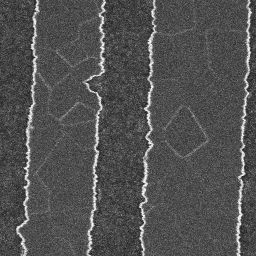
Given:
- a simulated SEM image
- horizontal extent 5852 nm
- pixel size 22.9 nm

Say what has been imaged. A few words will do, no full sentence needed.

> one or a few lines or trenches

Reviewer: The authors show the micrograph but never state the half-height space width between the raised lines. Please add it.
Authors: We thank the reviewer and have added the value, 1.13 um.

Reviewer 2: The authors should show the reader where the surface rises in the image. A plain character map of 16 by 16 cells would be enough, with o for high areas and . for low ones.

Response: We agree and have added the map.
..oooo....oooooo
..oooo....oooooo
..oooo...ooooooo
..oooo...ooooooo
..oooo...oooooo.
..oooo...oooooo.
..oooo...oooooo.
..oooo...oooooo.
..oooo...oooooo.
..oooo...oooooo.
..oooo...oooooo.
..oooo...oooooo.
..oooo...oooooo.
..oooo...oooooo.
.ooooo...oooooo.
..oooo...oooooo.